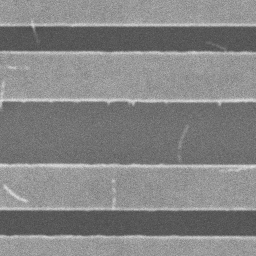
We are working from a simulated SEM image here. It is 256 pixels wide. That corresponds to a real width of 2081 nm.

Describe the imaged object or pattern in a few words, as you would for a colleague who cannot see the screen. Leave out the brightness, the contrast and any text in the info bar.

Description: lines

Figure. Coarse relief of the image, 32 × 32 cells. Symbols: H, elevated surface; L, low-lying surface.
HHHHHHHHHHHHHHHHHHHHHHHHHHHHHHHH
HHHHHHHHHHHHHHHHHHHHHHHHHHHHHHHH
HHHHHHHHHHHHHHHHHHHHHHHHHHHHHHHH
LLLLLLLLLLLLLLLLLLLLLLLLLLLLLLLL
LLLLLLLLLLLLLLLLLLLLLLLLLLLLLLLL
LLLLLLLLLLLLLLLLLLLLLLLLLLLLLLLL
HHHHHHHHHHHHHLHHHHHHHHHHHHHHHHHL
HHHHHHHHHHHHHHHHHHHHHHHHHHHHHHHH
HHHHHHHHHHHHHHHHHHHHHHHHHHHHHHHH
HHHHHHHHHHHHHHHHHHHHHHHHHHHHHHHH
HHHHHHHHHHHHHHHHHHHHHHHHHHHHHHHH
HHHHHHHHHHHHHHHHHHHHHHHHHHHHHHHH
HHHHHHHHHHHHHHHHHHHHHHHHHHHHHHHH
LLLLLLLLLLLLLLLLLLLLLLLLLLLLLLLL
LLLLLLLLLLLLLLLLLLLLLLLLLLLLLLLL
LLLLLLLLLLLLLLLLLLLLLLLLLLLLLLLL
LLLLLLLLLLLLLLLLLLLLLLLLLLLLLLLL
LLLLLLLLLLLLLLLLLLLLLLLLLLLLLLLL
LLLLLLLLLLLLLLLLLLLLLLLLLLLLLLLL
LLLLLLLLLLLLLLLLLLLLLLLLLLLLLLLL
LLLLLLLLLLLLLLLLLLLLLLLLLLLLLLLL
HHHHHHHHHHHHHHHHHHHHHHHHHHHHHHHH
HHHHHHHHHHHHHHHHHHHHHHHHHHHHHHHH
HHHHHHHHHHHHHHHHHHHHHHHHHHHHHHHH
HHHHHHHHHHHHHHHHHHHHHHHHHHHHHHHH
HHHHHHHHHHHHHHHHHHHHHHHHHHHHHHHH
LLLLLLLLLLLLLLLLLLLLLLLLLLLLLLLL
LLLLLLLLLLLLLLLLLLLLLLLLLLLLLLLL
LLLLLLLLLLLLLLLLLLLLLLLLLLLLLLLL
HHHHHHHHHHHHHLLHHHLLLHLLLLLLLLLL
HHHHHHHHHHHHHHHHHHHHHHHHHHHHHHHH
HHHHHHHHHHHHHHHHHHHHHHHHHHHHHHHH